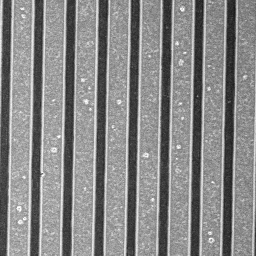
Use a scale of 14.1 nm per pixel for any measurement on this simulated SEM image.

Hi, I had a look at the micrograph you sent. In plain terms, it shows parallel lines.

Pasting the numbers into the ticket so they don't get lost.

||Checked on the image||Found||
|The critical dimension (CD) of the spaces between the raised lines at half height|0.155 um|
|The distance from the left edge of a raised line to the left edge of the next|453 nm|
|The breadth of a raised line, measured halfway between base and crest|298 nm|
